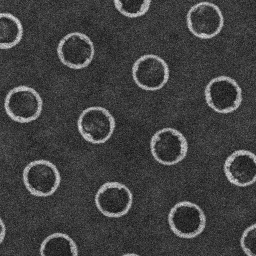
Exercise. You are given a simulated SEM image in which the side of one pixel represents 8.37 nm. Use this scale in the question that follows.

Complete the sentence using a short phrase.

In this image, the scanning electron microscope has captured a regular array of raised bodies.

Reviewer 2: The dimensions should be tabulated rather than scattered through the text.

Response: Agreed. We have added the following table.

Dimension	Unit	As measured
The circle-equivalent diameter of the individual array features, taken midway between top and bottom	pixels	34.3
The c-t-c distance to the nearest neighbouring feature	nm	631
